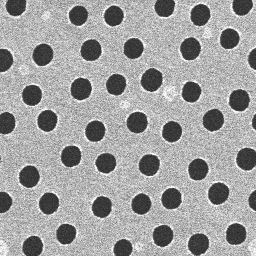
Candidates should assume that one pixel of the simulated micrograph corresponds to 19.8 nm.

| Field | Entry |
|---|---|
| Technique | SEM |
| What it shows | a regular array of holes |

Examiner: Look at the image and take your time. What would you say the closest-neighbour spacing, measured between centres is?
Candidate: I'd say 698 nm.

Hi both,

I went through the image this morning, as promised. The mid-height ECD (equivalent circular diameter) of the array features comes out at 426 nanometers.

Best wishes